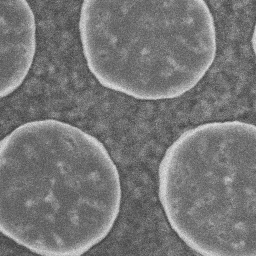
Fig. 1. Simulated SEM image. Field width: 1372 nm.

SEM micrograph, raised bodies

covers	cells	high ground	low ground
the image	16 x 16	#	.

##...########...
##...########...
##...########...
##...########...
##....#######...
#......#####....
................
................
.#####.....#####
#######....#####
#######...######
#######...######
#######...######
#######...######
#######....#####
..####......####